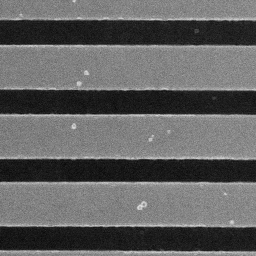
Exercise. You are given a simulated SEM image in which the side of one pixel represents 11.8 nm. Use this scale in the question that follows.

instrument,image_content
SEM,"lines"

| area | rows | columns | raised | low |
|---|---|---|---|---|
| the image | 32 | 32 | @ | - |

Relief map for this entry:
@@@@@@@@@@@@@@@@@@@@@@@@@@@@@@@@
@@@@@@@@@@@@@@@@@@@@@@@@@@@@@@@@
----------------------------@--@
--------------------------------
--------------------------------
--------------------------------
@@@@@@@@@@@@@@@@@@@@@@@@@@@@@@@@
@@@@@@@@@@@@@@@@@@@@@@@@@@@@@@@@
@@@@@@@@@@@@@@@@@@@@@@@@@@@@@@@@
@@@@@@@@@@@@@@@@@@@@@@@@@@@@@@@@
@@@@@@@@@@@@@@@@@@@@@@@@@@@@@@@@
--------------------------------
--------------------------------
--------------------------------
@@@@@@@@@@@@@@@@@@@@@@@@@@@@@@@@
@@@@@@@@@@@@@@@@@@@@@@@@@@@@@@@@
@@@@@@@@@@@@@@@@@@@@@@@@@@@@@@@@
@@@@@@@@@@@@@@@@@@@@@@@@@@@@@@@@
@@@@@@@@@@@@@@@@@@@@@@@@@@@@@@@@
@@@@@@@@@@@@@@@@@@@@@@@@@@@@@@@@
--------------------------------
--------------------------------
--------------------------------
@@@@@@@@@@@@@@@@@@@@@@@@@@@@@@@@
@@@@@@@@@@@@@@@@@@@@@@@@@@@@@@@@
@@@@@@@@@@@@@@@@@@@@@@@@@@@@@@@@
@@@@@@@@@@@@@@@@@@@@@@@@@@@@@@@@
@@@@@@@@@@@@@@@@@@@@@@@@@@@@@@@@
--------------------------------
--------------------------------
--------------------------------
@@@@@@@@@@@@@@@@@@@@@@@@@@@@@@@@